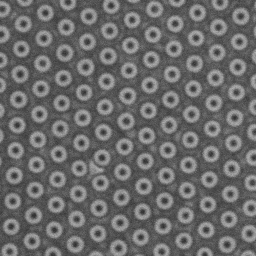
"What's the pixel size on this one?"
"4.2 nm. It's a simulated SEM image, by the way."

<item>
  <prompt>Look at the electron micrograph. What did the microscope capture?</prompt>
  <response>a regular array of ring-shaped raised bodies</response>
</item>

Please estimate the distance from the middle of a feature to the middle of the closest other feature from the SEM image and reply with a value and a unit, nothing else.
104 nm